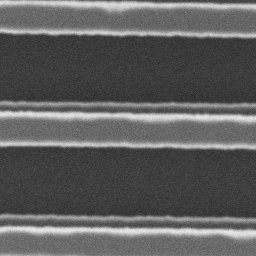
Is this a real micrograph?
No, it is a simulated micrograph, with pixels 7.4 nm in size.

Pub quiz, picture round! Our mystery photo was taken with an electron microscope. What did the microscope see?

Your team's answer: lines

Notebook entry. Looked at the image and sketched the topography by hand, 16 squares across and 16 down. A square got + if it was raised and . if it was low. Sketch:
++++++++++++++++
++++++++++++++++
................
................
................
................
................
++++++++++++++++
++++++++++++++++
................
................
................
................
................
++++++++++++++++
++++++++++++++++